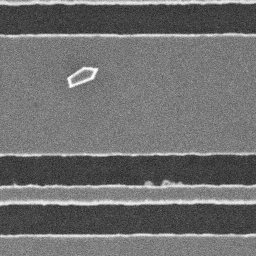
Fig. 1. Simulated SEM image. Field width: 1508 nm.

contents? lines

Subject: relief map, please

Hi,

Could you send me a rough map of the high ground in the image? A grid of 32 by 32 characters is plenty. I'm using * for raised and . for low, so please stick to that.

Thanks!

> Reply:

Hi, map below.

*******.**.*************.*......
................................
................................
................................
********************************
********************************
********************************
********************************
********************************
********************************
********************************
********************************
********************************
********************************
********************************
********************************
********************************
********************************
********************************
................................
................................
................................
................................
********************************
********************************
*....*.******..***..............
................................
................................
................................
********************************
********************************
********************************